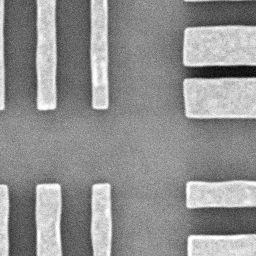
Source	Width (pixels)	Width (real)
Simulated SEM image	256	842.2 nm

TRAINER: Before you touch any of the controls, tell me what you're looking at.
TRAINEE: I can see groups of lines, slits or small figures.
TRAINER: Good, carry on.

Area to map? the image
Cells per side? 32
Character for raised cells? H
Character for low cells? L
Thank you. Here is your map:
LLLLLHHLLLLHHLLLLLLLLLLLLLLLLLLL
LLLLLHHLLLLHHLLLLLLLLLLLLLLLLLLL
LLLLLHHLLLLHHLLLLLLLLLLLLLLLLLLL
LLLLLHHLLLLHHLLLLLLLLLLLLHHHHHHH
LLLLLHHLLLLHHLLLLLLLLLLHHHHHHHHH
LLLLLHHLLLLHHLLLLLLLLLLHHHHHHHHH
LLLLLHHLLLLHHLLLLLLLLLLHHHHHHHHH
LLLLLHHLLLLHHLLLLLLLLLLHHHHHHHHH
LLLLLHHLLLLHHLLLLLLLLLLLLLLLLLLL
LLLLLHHLLLLLHLLLLLLLLLLLLLLLLLLL
LLLLLHHLLLLLHLLLLLLLLLLHHHHHHHHH
LLLLLHHLLLLLHLLLLLLLLLLHHHHHHHHH
LLLLLHHLLLLLHLLLLLLLLLLHHHHHHHHH
LLLLLHHLLLLLHLLLLLLLLLLHHHHHHHHH
LLLLLLLLLLLLLLLLLLLLLLLLHHHHHHHH
LLLLLLLLLLLLLLLLLLLLLLLLLLLLLLLL
LLLLLLLLLLLLLLLLLLLLLLLLLLLLLLLL
LLLLLLLLLLLLLLLLLLLLLLLLLLLLLLLL
LLLLLLLLLLLLLLLLLLLLLLLLLLLLLLLL
LLLLLLLLLLLLLLLLLLLLLLLLLLLLLLLL
LLLLLLLLLLLLLLLLLLLLLLLLLLLLLLLL
LLLLLLLLLLLLLLLLLLLLLLLLLLLLLLLL
LLLLLLLLLLLLLLLLLLLLLLLLLLLLLLLL
HLLLLHHLLLLLHHLLLLLLLLLHHHHHHHHH
HLLLLHHLLLLLHHLLLLLLLLLHHHHHHHHH
HLLLLHHLLLLLHHLLLLLLLLLHHHHHHHHH
HLLLLHHLLLLLHHLLLLLLLLLLLLLLLLLL
HLLLLHHLLLLLHHLLLLLLLLLLLLLLLLLL
HLLLLHHLLLLHHHLLLLLLLLLLLLLLLLLL
HLLLLHHLLLLHHHLLLLLLLLLLLLLLLHHH
HLLLLHHLLLLLHHLLLLLLLLLLHHHHHHHH
HLLLLHHHLLLLHHLLLLLLLLLLHHHHHHHH